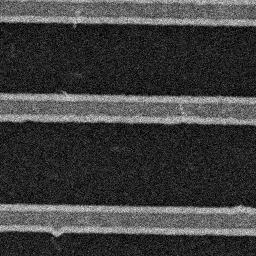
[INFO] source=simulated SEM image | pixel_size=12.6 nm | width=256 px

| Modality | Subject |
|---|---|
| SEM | one or a few lines or trenches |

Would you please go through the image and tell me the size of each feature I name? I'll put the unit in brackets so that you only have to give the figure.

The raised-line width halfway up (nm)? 262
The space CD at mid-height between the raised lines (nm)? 1040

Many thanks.